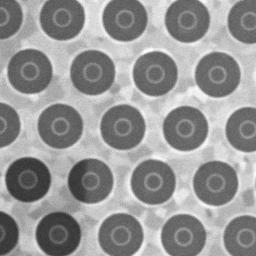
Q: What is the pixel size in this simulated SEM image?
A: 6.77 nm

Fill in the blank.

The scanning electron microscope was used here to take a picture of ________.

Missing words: an array of small figures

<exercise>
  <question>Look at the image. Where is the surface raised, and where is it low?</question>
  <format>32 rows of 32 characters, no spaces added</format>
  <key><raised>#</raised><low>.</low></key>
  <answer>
...##.....###.....###.....###...
...##......##.....###.....###...
...##......##......##.....##....
...##.....###.....###.....##....
..####....###.....###.....###...
#######################.#######.
##...#####...#####...#####..####
#.....###.....###.....###.....##
#......##.....###.....##......##
#......##.....##......##......##
#.....###.....###.....###.....##
##...#####...#####...####....###
################################
..####...#####...#####...#####..
..###.....###.....###.....###...
...##.....##......##......##....
...##.....##......##......##....
..###.....###.....###.....##....
.#####...#####...####....####...
###.############################
#.....###....####....####....###
#.....###.....###.....##......##
......##......##......##......##
#.....###.....##......##......##
#.....###.....###.....##.....###
###########.######..#####...####
.######.########################
..###.....###....####....####...
..##......##......##......##....
...#......##......##......##....
..###.....##......##......##....
.####....####....####....###....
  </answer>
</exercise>